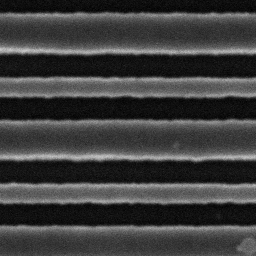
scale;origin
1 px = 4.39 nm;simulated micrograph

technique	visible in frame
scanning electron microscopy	lines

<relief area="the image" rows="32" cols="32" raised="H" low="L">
LLLLLLLLLLLLLLLLLLLLLLLLLLLLLLLL
LLLLLLLLLLLLLLLLLLLLLLLLLLLLLLLL
HHHHHHHHHHHHHHHHHHHHHHHHHHHHHHHH
HHHHHHHHHHHHHHHHHHHHHHHHHHHHHHHH
HHHHHHHHHHHHHHHHHHHHHHHHHHHHHHHH
HHHHHHHHHHHHHHHHHHHHHHHHHHHHHHHH
HLHHHHHHHHHHHHHHHHHHHHHHHHHHHHHH
LLLLLLLLLLLLLLLLLLLLLLLLLLLLLLLL
LLLLLLLLLLLLLLLLLLLLLLLLLLLLLLLL
LLLLLLLLLLLLLLLLLLLLLLLLLLLLLLLL
HHHHHHHHHHHHHHHHHHHHHHHHHHHHHHHH
HHHHHHHHHHHHHHHHHHHHHHHHHHHHHHHH
LLLLLLLLLLLLLLLLLLLLLLLLLLLLLLLL
LLLLLLLLLLLLLLLLLLLLLLLLLLLLLLLL
LLLLLLLLLLLLLLLLLLLLLLLLLLLLLLLL
HHHHHHHHHHHHHHHHHHHHHHHHHHHHHHHH
HHHHHHHHHHHHHHHHHHHHHHHHHHHHHHHH
HHHHHHHHHHHHHHHHHHHHHHHHHHHHHHHH
HHHHHHHHHHHHHHHHHHHHHHHHHHHHHHHH
HHHHHHHHHHHHHHHHHHHHHHHHHHHHHHHH
LLLLLLLLLLLLLLLLLLLLLLLLLLLLLLLL
LLLLLLLLLLLLLLLLLLLLLLLLLLLLLLLL
LLLLLLLLLLLLLLLLLLLLLLLLLLLLLLLL
HHHHHHHHHHHHHHHHHHHHHHHHHHHHHHHH
HHHHHHHHHHHHHHHHHHHHHHHHHHHHHHHH
LLLLLLLLLLLLLLLLLLLLLLLLLLLLLLLL
LLLLLLLLLLLLLLLLLLLLLLLLLLLLLLLL
LLLLLLLLLLLLLLLLLLLLLLLLLLLLLLLL
HHHHHHHHHHHHHHHHHHHHHHHHHHHHHHHH
HHHHHHHHHHHHHHHHHHHHHHHHHHHHHHHH
HHHHHHHHHHHHHHHHHHHHHHHHHHHHHHHH
HHHHHHHHHHHHHHHHHHHHHHHHHHHHHHHH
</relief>